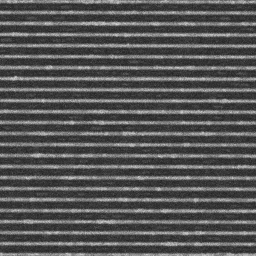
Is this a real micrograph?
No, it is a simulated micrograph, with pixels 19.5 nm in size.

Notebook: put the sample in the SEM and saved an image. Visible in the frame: parallel lines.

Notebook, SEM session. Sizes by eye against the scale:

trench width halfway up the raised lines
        161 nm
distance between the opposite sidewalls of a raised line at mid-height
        53.7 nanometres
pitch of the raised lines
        215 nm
